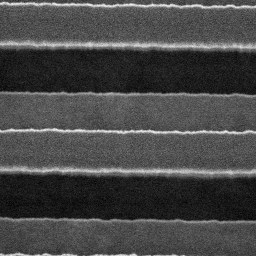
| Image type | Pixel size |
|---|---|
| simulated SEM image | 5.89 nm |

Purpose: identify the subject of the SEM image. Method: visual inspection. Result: lines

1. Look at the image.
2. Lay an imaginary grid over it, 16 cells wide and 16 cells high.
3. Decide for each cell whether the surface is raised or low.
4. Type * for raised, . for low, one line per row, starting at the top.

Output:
****************
****************
****************
................
................
................
****************
****************
****************
****************
****************
................
................
................
****************
****************